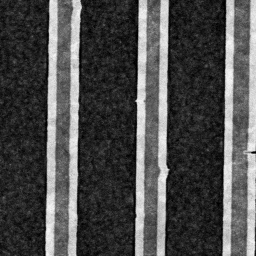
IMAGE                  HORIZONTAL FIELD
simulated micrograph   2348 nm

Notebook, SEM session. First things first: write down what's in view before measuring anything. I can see one or a few lines or trenches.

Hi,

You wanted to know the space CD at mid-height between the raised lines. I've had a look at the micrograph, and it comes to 596 nm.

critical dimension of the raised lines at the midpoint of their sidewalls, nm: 217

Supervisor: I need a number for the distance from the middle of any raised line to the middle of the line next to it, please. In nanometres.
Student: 814